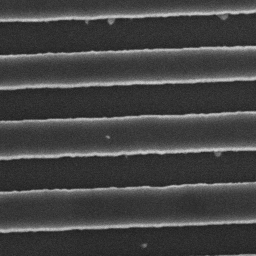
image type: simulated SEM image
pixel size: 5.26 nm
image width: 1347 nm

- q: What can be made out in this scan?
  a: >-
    lines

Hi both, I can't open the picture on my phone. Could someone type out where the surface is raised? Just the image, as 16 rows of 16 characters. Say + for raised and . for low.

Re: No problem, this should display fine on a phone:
++++++++++++++++
................
................
++++++++++++++++
++++++++++++++++
+...............
................
...+++++++++++++
++++++++++++++++
++++++++++++....
................
............++++
++++++++++++++++
++++++++++++++++
................
................